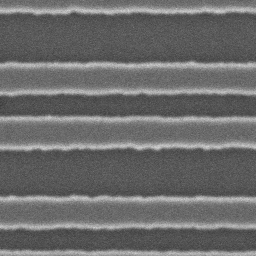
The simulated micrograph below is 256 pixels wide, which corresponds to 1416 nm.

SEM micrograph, lines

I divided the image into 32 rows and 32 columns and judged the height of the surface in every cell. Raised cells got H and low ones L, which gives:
HHHHHHHHHHHHHHHHHHHHHHHHHHHHHHHH
HLLLHHHHHLHHLHHLLLLHHHHHLLLHLLLL
LLLLLLLLLLLLLLLLLLLLLLLLLLLLLLLL
LLLLLLLLLLLLLLLLLLLLLLLLLLLLLLLL
LLLLLLLLLLLLLLLLLLLLLLLLLLLLLLLL
LLLLLLLLLLLLLLLLLLLLLLLLLLLLLLLL
LLLLLLLLLLLLLLLLLLLLLLLLLLLLLLLL
LLLLLLLLLLLLLLLLLLLLLLLLLLLLLLLL
HHHHHHHHHHHHHHHHHHHHHHHHHHHHHHHH
HHHHHHHHHHHHHHHHHHHHHHHHHHHHHHHH
HHHHHHHHHHHHHHHHHHHHHHHHHHHHHHHH
HHHHHHHHHHHHHHHHHHHHHHHHHHHHHHHH
LLLLLLLLLLLLLLLLLLLLLLLLLLLLLLLL
LLLLLLLLLLLLLLLLLLLLLLLLLLLLLLLL
LLLLLLLLLLLLLLLLLLLLLLLLLLLLLLLL
HHHHHHHHHHHHHHHHHHHHHHHHHHHHHHHH
HHHHHHHHHHHHHHHHHHHHHHHHHHHHHHHH
HHHHHHHHHHHHHHHHHHHHHHHHHHHHHHHH
HHHHHHHHHHHHHLLLLHLHLLLLLHLHLLLL
LLLLLLLLLLLLLLLLLLLLLLLLLLLLLLLL
LLLLLLLLLLLLLLLLLLLLLLLLLLLLLLLL
LLLLLLLLLLLLLLLLLLLLLLLLLLLLLLLL
LLLLLLLLLLLLLLLLLLLLLLLLLLLLLLLL
LLLLLLLLLLLLLLLLLLLLLLLLLLLLLLLL
LLLLLLLLLLLLLLLLLLLLLLLLLLLLLLLL
HHHHHHHHHHHHHHHHHHHHHHHHHHHHHHHH
HHHHHHHHHHHHHHHHHHHHHHHHHHHHHHHH
HHHHHHHHHHHHHHHHHHHHHHHHHHHHHHHH
LLLLHHLLLLLLHLLLLLLLLLLLLLLLLLLL
LLLLLLLLLLLLLLLLLLLLLLLLLLLLLLLL
LLLLLLLLLLLLLLLLLLLLLLLLLLLLLLLL
HHHHHHHHHHHLHHHHHHHHLHLHLLLLLLLH